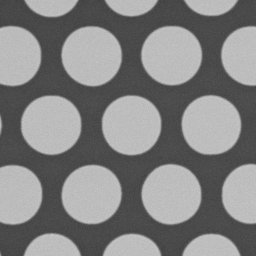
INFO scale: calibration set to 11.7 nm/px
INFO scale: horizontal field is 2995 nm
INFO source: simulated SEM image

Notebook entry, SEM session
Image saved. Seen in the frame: an array of small figures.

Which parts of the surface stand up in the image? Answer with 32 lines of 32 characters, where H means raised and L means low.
LLLHHHHHHLLLLHHHHHHLLLLHHHHHHLLL
LLLLHHHHLLLLLLLHHHLLLLLLLHHHLLLL
LLLLLLLLLLLLLLLLLLLLLLLLLLLLLLLL
HHHLLLLLLLHHHLLLLLLLHHHLLLLLLLHH
HHHHLLLLLHHHHHLLLLLHHHHHLLLLLHHH
HHHHHLLLHHHHHHHLLLHHHHHHHLLLHHHH
HHHHHLLLHHHHHHHLLLHHHHHHHLLLHHHH
HHHHHLLLHHHHHHHLLLHHHHHHHLLLHHHH
HHHHHLLLHHHHHHHLLLHHHHHHHLLLHHHH
HHHHLLLLLHHHHHLLLLLHHHHHLLLLLHHH
HHHLLLLLLLHHHLLLLLLLLHLLLLLLLLHH
LLLLLLLLLLLLLLLLLLLLLLLLLLLLLLLL
LLLLHHHHLLLLLLHHHHLLLLLLHHHHLLLL
LLLHHHHHHLLLLHHHHHHLLLLHHHHHHLLL
LLLHHHHHHHLLLHHHHHHHLLLHHHHHHHLL
LLLHHHHHHHLLLHHHHHHHLLLHHHHHHHLL
LLLHHHHHHHLLLHHHHHHHLLLHHHHHHHLL
LLLHHHHHHHLLLHHHHHHHLLLHHHHHHHLL
LLLLHHHHHLLLLLHHHHHLLLLLHHHHHLLL
LLLLLLLLLLLLLLLLLLLLLLLLLLLLLLLL
LLLLLLLLLLLLLLLLLLLLLLLLLLLLLLLL
HHHHLLLLLHHHHHLLLLLHHHHHLLLLLHHH
HHHHHLLLHHHHHHHLLLHHHHHHHLLLHHHH
HHHHHLLLHHHHHHHLLLHHHHHHHLLLHHHH
HHHHHLLLHHHHHHHLLLHHHHHHHLLLHHHH
HHHHHLLLHHHHHHHLLLHHHHHHHLLLHHHH
HHHHHLLLHHHHHHLLLLHHHHHHLLLLHHHH
HHHLLLLLLLHHHLLLLLLLHHHLLLLLLLHH
LLLLLLLLLLLLLLLLLLLLLLLLLLLLLLLL
LLLLLHHHLLLLLLLHHHLLLLLLLHHHLLLL
LLLLHHHHHLLLLLHHHHHLLLLLHHHHHLLL
LLLHHHHHHHLLLHHHHHHHLLLHHHHHHHLL